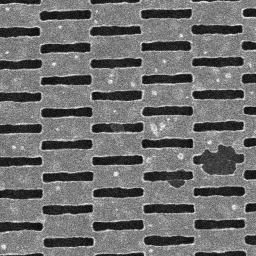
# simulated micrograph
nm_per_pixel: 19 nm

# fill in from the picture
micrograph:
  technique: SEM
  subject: a regular array of holes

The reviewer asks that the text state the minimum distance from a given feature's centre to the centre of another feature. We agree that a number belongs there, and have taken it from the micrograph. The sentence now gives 613 nm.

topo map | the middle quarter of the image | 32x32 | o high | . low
oooooo.............ooooooooooooo
oooooooooooooooooooooooooooooooo
oooooooooooooooooooooooooooo....
.......oooooooooooo.............
.......oooooooooooo.............
oooooooooooooooooooooooooooooooo
oooooooooooooooooooooooooooooooo
ooooooo............ooooooooooooo
ooooooo............ooooooooooooo
oooooooooooooooooooooooooooooooo
ooooooooooooooooooooooooo.o.oooo
.......ooooooooooooo............
.......ooooooooooooo............
oooooooooooooooooooooooooooooooo
oooooooooooooooooooooooooooooooo
ooooooo.............oooooooooooo
ooooooo.............oooooooooooo
oooooooooooooooooooooooooooooooo
ooooooooooooooooooooooooo.o..ooo
.......oooooooooooo.............
.......ooooooooooooo............
oooooooooooooooooooooooooooooooo
oooooooooooooooooooooooooooooooo
ooooooo.............oooooooooooo
ooooooo.............oooooooooooo
oooooooooooooooooooooooooooooooo
ooooooooooooooooooooooooooooo.oo
.......ooooooooooooo............
........oooooooooooo............
..oooooooooooooooooooooooo....oo
ooooooooooooooooooooooooooo...oo
oooooooo............oooooooooooo